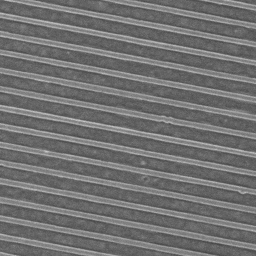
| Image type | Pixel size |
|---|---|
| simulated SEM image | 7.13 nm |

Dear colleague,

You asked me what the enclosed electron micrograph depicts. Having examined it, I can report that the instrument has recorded parallel lines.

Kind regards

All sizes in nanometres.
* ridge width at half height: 36.8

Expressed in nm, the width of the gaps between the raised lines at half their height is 92.9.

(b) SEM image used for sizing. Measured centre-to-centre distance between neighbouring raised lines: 129 nm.